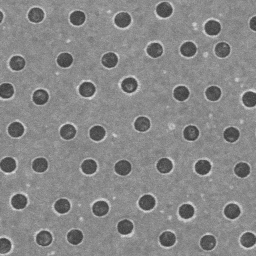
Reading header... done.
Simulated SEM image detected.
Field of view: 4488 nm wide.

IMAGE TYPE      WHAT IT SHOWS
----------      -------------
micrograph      a regular array of holes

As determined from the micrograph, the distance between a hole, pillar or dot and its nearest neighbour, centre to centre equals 589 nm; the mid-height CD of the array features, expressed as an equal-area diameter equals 0.294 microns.